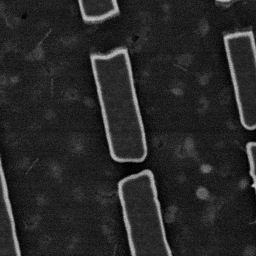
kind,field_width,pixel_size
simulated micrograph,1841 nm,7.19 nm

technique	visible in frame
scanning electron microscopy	one or a few lines or trenches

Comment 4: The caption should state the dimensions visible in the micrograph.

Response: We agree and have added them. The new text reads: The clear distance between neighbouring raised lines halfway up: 0.729 micrometres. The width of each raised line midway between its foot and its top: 243 nm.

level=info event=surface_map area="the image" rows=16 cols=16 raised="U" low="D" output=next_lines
DDDDDUUDDDDDDDDD
DDDDDDDDDDDDDDDD
DDDDDDDDDDDDDDUU
DDDDDDDUDDDDDDUU
DDDDDDUUDDDDDDDU
DDDDDDUUDDDDDDDU
DDDDDDUUUDDDDDDU
DDDDDDDUUDDDDDDU
DDDDDDDUUDDDDDDD
DDDDDDDUUDDDDDDD
DDDDDDDDDDDDDDDD
DDDDDDDDUUDDDDDD
DDDDDDDDUUDDDDDD
UDDDDDDDUUDDDDDD
UDDDDDDDUUDDDDDD
UDDDDDDDUUDDDDDD